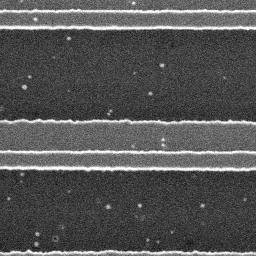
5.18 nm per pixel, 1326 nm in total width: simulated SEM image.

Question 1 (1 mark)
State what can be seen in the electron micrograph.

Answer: lines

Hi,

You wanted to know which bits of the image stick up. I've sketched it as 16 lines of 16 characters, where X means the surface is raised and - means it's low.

XXXXXXXXXXXXXXXX
XXXXXXXXXXXXXXXX
----------------
----------------
----------------
----------------
----------------
----------------
XXXXXXXXXXXXXXXX
XXXXXXXXXXXXXXXX
XXXXXXXXXXXXXXXX
----------------
----------------
----------------
----------------
----------------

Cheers